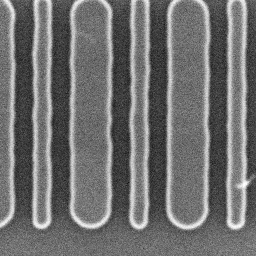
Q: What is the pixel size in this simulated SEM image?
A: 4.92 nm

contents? groups of lines, slits or small figures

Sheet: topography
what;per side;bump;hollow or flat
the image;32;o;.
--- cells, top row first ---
o...oo...oooo....oo..oooo....oo.
oo..oo...ooooo...oo..ooooo...oo.
oo..oo...ooooo..ooo..ooooo...oo.
oo..oo...ooooo..ooo..ooooo...oo.
oo..oo...ooooo...oo..ooooo...oo.
oo..oo...ooooo...oo..ooooo...oo.
oo..oo...ooooo..ooo..ooooo...oo.
oo..oo...ooooo..ooo..ooooo...oo.
oo..oo...ooooo...oo..ooooo...oo.
oo..oo...ooooo...oo..ooooo...oo.
oo..oo...ooooo...o...ooooo...oo.
oo..oo...ooooo...o...ooooo...oo.
oo..oo...ooooo...o...ooooo...oo.
oo..oo...ooooo...o...ooooo...oo.
oo..oo...ooooo..oo...ooooo...oo.
oo..oo...ooooo..oo...ooooo...oo.
oo..oo...ooooo..oo...ooooo...oo.
oo..oo...ooooo...o...ooooo...oo.
oo..oo...ooooo...o...ooooo...oo.
oo..oo...ooooo..oo...ooooo...oo.
oo..oo...ooooo..oo...ooooo...oo.
oo..oo...ooooo..oo...ooooo...oo.
oo..oo...ooooo...o...ooooo..ooo.
oo..oo...ooooo...o...ooooo..ooo.
oo..oo...ooooo..oo...ooooo...oo.
oo..oo...ooooo..oo...ooooo...oo.
oo..oo...ooooo..oo...ooooo...oo.
o...oo...oooo...oo...oooo....o..
................................
................................
................................
................................